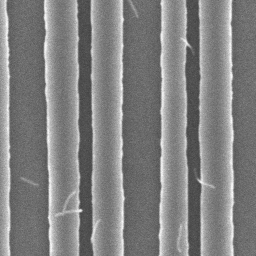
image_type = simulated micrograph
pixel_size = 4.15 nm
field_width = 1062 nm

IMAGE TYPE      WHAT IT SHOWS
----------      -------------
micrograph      lines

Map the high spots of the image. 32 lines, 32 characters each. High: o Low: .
o.....oooo.oooo.....ooo..oooo...
o.....oooo.oooo.....ooo..oooo...
o.....oooo.oooo.....ooo..oooo...
o.....oooo..ooo.....ooo..oooo...
o.....oooo..ooo.....ooo..oooo...
o.....oooo.oooo.....ooo..oooo...
o.....oooo.oooo.....ooo..oooo...
o.....oooo..ooo.....ooo..oooo...
o.....oooo..ooo.....ooo..oooo...
o.....oooo.oooo.....ooo..oooo...
o.....oooo..ooo.....ooo..oooo...
o.....oooo..ooo.....ooo..oooo...
o.....oooo..ooo.....ooo..oooo...
o.....oooo..ooo.....ooo..oooo...
o.....oooo..ooo.....ooo..oooo...
o.....oooo..ooo.....ooo..oooo...
o.....oooo..ooo.....ooo..oooo...
o.....oooo..ooo.....ooo..oooo...
o.....oooo..ooo.....ooo..oooo...
o.....oooo..ooo.....ooo..oooo...
o.....oooo..ooo.....ooo..oooo...
o.....oooo..ooo.....ooo..oooo...
o.....oooo..ooo.....ooo..oooo...
o.....oooo..ooo.....ooo..oooo...
o.....oooo..ooo.....ooo..oooo...
o.....oooo..ooo.....ooo..oooo...
o.....oooo..ooo.....ooo..oooo...
o.....oooo..ooo.....ooo..oooo...
o.....oooo..ooo.....ooo..oooo...
o.....oooo..ooo.....ooo..oooo...
o.....oooo..ooo.....oooo.oooo...
o.....oooo..ooo.....oooo.oooo...